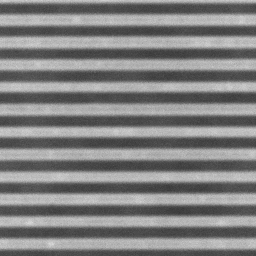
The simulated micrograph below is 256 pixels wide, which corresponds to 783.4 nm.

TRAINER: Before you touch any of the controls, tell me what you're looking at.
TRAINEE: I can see parallel lines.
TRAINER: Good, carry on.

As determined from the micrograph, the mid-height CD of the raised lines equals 27.6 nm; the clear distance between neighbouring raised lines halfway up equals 13.5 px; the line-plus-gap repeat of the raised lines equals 68.5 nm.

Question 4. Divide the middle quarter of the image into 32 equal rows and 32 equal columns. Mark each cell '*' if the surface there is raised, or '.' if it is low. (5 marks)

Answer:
********************************
................................
................................
................................
................................
********************************
********************************
................................
................................
................................
********************************
********************************
*************...**...****.......
................................
................................
................................
********************************
********************************
................................
................................
................................
................................
********************************
********************************
................................
................................
................................
********************************
********************************
................................
................................
................................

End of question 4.